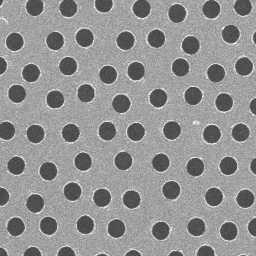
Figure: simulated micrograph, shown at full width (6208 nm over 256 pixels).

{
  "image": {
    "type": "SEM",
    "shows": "a regular array of holes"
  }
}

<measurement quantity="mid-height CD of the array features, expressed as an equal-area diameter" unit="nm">438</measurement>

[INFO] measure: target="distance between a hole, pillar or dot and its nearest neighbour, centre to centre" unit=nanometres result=745